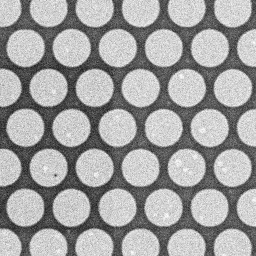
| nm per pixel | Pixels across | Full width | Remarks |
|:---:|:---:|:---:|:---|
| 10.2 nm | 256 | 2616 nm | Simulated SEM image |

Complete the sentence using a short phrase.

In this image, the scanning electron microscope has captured an array of small figures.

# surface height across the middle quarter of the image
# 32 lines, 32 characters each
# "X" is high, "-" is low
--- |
-XX---------XXX---------XX------
-------XX---------XX----------XX
-----XXXXXX-----XXXXXX------XXXX
----XXXXXXXX---XXXXXXXX----XXXXX
X--XXXXXXXXX---XXXXXXXXX--XXXXXX
X--XXXXXXXXX---XXXXXXXXX--XXXXXX
X--XXXXXXXXX---XXXXXXXXX--XXXXXX
X--XXXXXXXXX---XXXXXXXXX--XXXXXX
----XXXXXXXX---XXXXXXXX----XXXXX
-----XXXXXX-----XXXXXX------XXXX
-------XX---------XX----------XX
-XX---------XXX---------XX------
XXXXX-----XXXXXX------XXXXXX----
XXXXXX---XXXXXXXX----XXXXXXXX---
XXXXXX---XXXXXXXXX--XXXXXXXXX---
XXXXXX---XXXXXXXXX--XXXXXXXXX---
XXXXXX---XXXXXXXXX--XXXXXXXXX---
XXXXXX---XXXXXXXXX---XXXXXXXX---
XXXXXX---XXXXXXXX----XXXXXXXX---
XXXXX-----XXXXXX------XXXXXX----
-XX---------XX------------------
------XXX---------XX---------XXX
-----XXXXXX-----XXXXXX------XXXX
----XXXXXXX----XXXXXXXX----XXXXX
---XXXXXXXXX---XXXXXXXXX--XXXXXX
X--XXXXXXXXX---XXXXXXXXX--XXXXXX
X--XXXXXXXXX---XXXXXXXXX--XXXXXX
---XXXXXXXXX---XXXXXXXXX--XXXXXX
----XXXXXXXX---XXXXXXXX----XXXXX
-----XXXXXX-----XXXXXX------XXXX
-------XX-----------------------
-XX---------XXX---------XX------